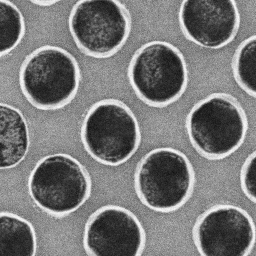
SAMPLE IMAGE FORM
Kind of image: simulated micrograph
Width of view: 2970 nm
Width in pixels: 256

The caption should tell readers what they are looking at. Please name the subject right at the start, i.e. raised bodies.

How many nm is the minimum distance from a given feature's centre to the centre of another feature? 856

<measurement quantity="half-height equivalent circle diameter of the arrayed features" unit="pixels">58.3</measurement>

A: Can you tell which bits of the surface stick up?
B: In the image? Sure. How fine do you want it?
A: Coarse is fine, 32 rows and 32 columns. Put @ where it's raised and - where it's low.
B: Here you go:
@---------@@@@@--------@@@@@@---
@@-------@@@@@@@-------@@@@@@@--
@@@------@@@@@@@-------@@@@@@@--
@@@------@@@@@@@-------@@@@@@@--
@@@------@@@@@@@--------@@@@@---
@@--------@@@@@----@@----@@@---@
@----@@@---@@@---@@@@@--------@@
----@@@@@--------@@@@@@-------@@
---@@@@@@@------@@@@@@@------@@@
---@@@@@@@------@@@@@@@-------@@
---@@@@@@@-------@@@@@@-------@@
---@@@@@@--------@@@@@@--------@
----@@@@----------@@@-----@@@---
------------@@@@--------@@@@@@--
-@---------@@@@@@-------@@@@@@--
-----------@@@@@@-------@@@@@@@-
----------@@@@@@@-------@@@@@@@-
----------@@@@@@@-------@@@@@@--
-----------@@@@@@--------@@@@---
------@@----@@@@--@@@@@----@----
-----@@@@@--------@@@@@--------@
----@@@@@@-------@@@@@@@------@@
----@@@@@@@------@@@@@@@------@@
----@@@@@@@------@@@@@@@-------@
----@@@@@@@-------@@@@@--------@
-----@@@@@--------@@@@@---------
------@@----@@@@----------@@@@--
@@@--------@@@@@@--------@@@@@@-
@@@@-------@@@@@@@-------@@@@@@@
@@@@-------@@@@@@@-------@@@@@@@
@@@@-------@@@@@@@-------@@@@@@-
@@@@-------@@@@@@--------@@@@@@-